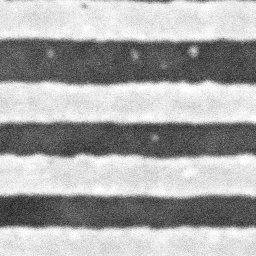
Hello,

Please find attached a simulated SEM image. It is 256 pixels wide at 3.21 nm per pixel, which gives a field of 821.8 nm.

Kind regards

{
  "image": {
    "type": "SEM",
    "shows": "lines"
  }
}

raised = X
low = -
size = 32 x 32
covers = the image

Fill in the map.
XXXXXXXXXX-XXXXXXXXX-XXXXXXXXXXX
XXXXXXXXXXXXXXXXXXXXXXXXXXXXXXXX
XXXXXXXXXXXXXXXXXXXXXXXXXXXXXXXX
XXXXXXXXXXXXXXXXXXXXXXXXXXXXXXXX
XXXXXXXXXXXXXXXXXXXXXXXXXXXXXXXX
--------------------------------
--------------------------------
--------------------------------
--------------------------------
--------------------------------
XX----X-------------X-X--XX-----
XXXXXXXXXXXXXXXXXXXXXXXXXXXXXXXX
XXXXXXXXXXXXXXXXXXXXXXXXXXXXXXXX
XXXXXXXXXXXXXXXXXXXXXXXXXXXXXXXX
XXXXXXXXXXXXXXXXXXXXXXXXXXXXXXXX
--------------------------------
--------------------------------
--------------------------------
--------------------------------
----------X---------------------
XXXXXXXXXXXXXXXXXXXXXXXXXXXXXXXX
XXXXXXXXXXXXXXXXXXXXXXXXXXXXXXXX
XXXXXXXXXXXXXXXXXXXXXXXXXXXXXXXX
XXXXXXXXXXXXXXXXXXXXXXXXXXXXXXXX
--------------------------------
--------------------------------
--------------------------------
--------------------------------
--------------------------------
XXXXXXXXXXXXXXXXXXXXXXXXXXXXXXXX
XXXXXXXXXXXXXXXXXXXXXXXXXXXXXXXX
XXXXXXXXXXXXXXXXXXXXXXXXXXXXXXXX